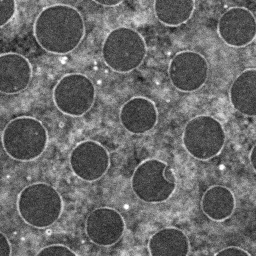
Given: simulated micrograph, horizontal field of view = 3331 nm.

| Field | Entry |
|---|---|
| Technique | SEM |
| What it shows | a regular array of raised bodies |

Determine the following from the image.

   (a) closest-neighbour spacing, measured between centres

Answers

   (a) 865 nm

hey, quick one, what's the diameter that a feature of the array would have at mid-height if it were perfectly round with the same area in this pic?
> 548 nm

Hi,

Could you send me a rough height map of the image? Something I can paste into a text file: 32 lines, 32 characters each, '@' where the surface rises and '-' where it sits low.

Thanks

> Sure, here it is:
@@-----------@@----@@@@@--------
@@---@@@@@---------@@@@@----@@@-
@----@@@@@----------@@@----@@@@@
----@@@@@@@----@-----------@@@@@
----@@@@@@---@@@@@----------@@@@
-----@@@@@---@@@@@----------@@@-
------@@@----@@@@@-----@--------
@@@----------@@@@@----@@@@------
@@@@----------@@@----@@@@@------
@@@@----@@@----------@@@@@----@@
@@@@---@@@@@----------@@@----@@@
@@-----@@@@@-----------------@@@
-------@@@@@----@@@----------@@@
-------@@@@----@@@@----------@@@
---------@-----@@@@@-----@-----@
-@@@@----------@@@@----@@@@@----
@@@@@@----------@@-----@@@@@----
@@@@@@-----------------@@@@@----
-@@@@@---@@@@----------@@@@@----
-@@@@----@@@@@----------@@@----@
---------@@@@@----@@@----------@
---------@@@@----@@@------------
-----------@----@@@@@-----------
---@@@@---------@@@@@@----@@----
--@@@@@----------@@@@----@@@@---
--@@@@@@-----------------@@@@---
--@@@@@@---@@@@-----------@@@---
---@@@@----@@@@------------@----
-----------@@@@@-----@----------
@----------@@@@----@@@@---------
@-----------@@-----@@@@@--------
@----@@@@----------@@@@@---@@@@-